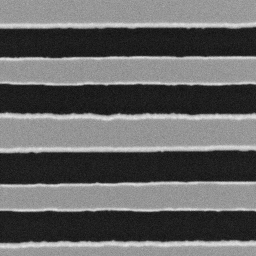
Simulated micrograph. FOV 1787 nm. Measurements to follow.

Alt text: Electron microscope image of lines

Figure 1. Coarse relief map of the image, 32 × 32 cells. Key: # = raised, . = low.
################################
################################
################################
................................
................................
................................
................................
################################
################################
################################
.....######..#.......#.#####....
................................
................................
................................
#############.##################
################################
################################
################################
################################
................................
................................
................................
................................
################################
################################
################################
................................
................................
................................
................................
..##############################
################################